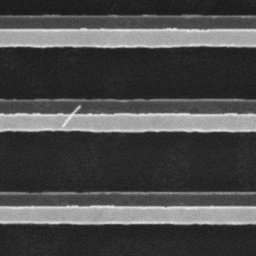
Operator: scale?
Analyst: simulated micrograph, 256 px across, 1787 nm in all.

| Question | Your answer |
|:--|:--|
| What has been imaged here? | lines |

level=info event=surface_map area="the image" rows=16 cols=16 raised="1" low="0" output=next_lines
0000000000000000
1111111111111111
1111111111111111
0000000000000000
0000000000000000
0000000000000000
1111111111111111
1111111111111111
0000000000000000
0000000000000000
0000000000000000
0000000000000000
1111111111111111
1111111111111111
0000000000000000
0000000000000000